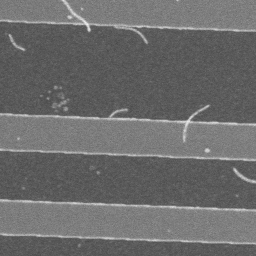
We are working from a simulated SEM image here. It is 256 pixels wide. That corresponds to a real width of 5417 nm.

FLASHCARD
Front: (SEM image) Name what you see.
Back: lines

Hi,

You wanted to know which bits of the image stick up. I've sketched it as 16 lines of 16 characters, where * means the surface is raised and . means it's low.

****************
....************
................
................
................
................
................
**********......
****************
....************
................
................
................
****************
****************
................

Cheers